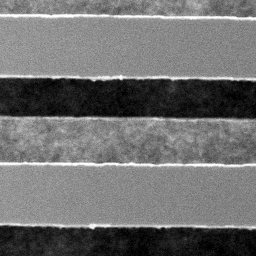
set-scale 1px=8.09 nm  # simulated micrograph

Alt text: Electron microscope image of lines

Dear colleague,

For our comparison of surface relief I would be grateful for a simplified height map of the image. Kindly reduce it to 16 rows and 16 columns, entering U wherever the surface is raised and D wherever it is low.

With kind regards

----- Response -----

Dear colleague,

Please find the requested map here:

UUUUUUUUUUUUUUUU
UUUUUUUUUUUUUUUU
UUUUUUUUUUUUUUUU
UUUUUUUUUUUUUUUU
UUUUUUUUUUUUUUUU
DDDDDDDDDDDDDDDD
DDDDDDDDDDDDDDDD
UUUUUUUUUUDDDDDD
UUUUUUUUUUUUUUUU
UUUUUUUUUUUUUUUU
UUUUUUUUUUUUUUUU
UUUUUUUUUUUUUUUU
UUUUUUUUUUUUUUUU
UUUUUUUUUUUUUUUU
DDDDDDDDDDDDDDDD
DDDDDDDDDDDDDDDD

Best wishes